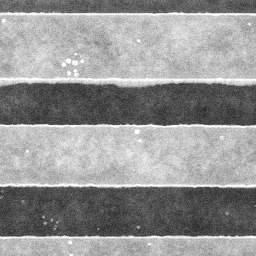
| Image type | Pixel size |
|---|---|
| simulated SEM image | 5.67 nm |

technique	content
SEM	lines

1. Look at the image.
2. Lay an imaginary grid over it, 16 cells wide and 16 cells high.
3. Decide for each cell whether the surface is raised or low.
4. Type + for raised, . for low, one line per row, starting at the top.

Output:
................
++++++++++++++++
++++++++++++++++
++++++++++++++++
++++++++++++++++
................
................
................
++++++++++++++++
++++++++++++++++
++++++++++++++++
++++++++++++++++
................
................
................
++++++++++++++++